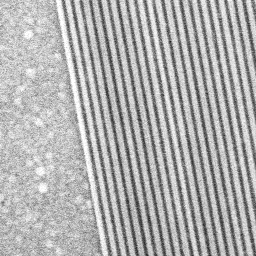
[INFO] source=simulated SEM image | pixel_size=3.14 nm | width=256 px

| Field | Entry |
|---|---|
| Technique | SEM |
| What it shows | parallel lines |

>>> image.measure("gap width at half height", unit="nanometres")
14.6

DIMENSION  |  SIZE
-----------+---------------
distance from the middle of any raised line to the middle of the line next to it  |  27.9 nm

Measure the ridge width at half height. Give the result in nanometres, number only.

14.2